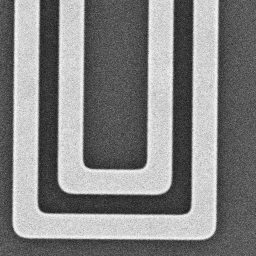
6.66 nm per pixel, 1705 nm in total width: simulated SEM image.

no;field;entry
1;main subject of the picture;groups of lines, slits or small figures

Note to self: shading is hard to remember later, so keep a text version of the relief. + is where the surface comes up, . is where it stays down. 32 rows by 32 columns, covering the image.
..+++...++.........+++..+++.....
..+++...++.........+++..+++.....
..+++..+++.........+++..+++.....
..+++..+++.........+++..+++.....
..+++..+++.........+++..+++.....
..+++..+++.........+++..+++.....
..+++..+++.........+++..+++.....
..+++..+++.........+++..+++.....
..+++..+++.........+++..+++.....
..+++..+++.........+++..+++.....
..+++..+++.........+++..+++.....
..+++..+++.........+++..+++.....
..+++..+++.........+++..+++.....
..+++..+++.........+++..+++.....
..+++..+++.........+++..+++.....
..+++..+++.........+++..+++.....
..+++..+++.........++...+++.....
..+++..+++.........++...+++.....
..+++..+++.........++...+++.....
..+++..+++.........++...+++.....
..+++..+++........+++...+++.....
..+++..++++++++++++++...+++.....
..+++..++++++++++++++...+++.....
..+++...+++++++++++++...+++.....
..+++...................+++.....
..+++...................+++.....
..+++...................+++.....
..+++++++++++++++++++++++++.....
..+++++++++++++++++++++++++.....
...+++++++++++++++++++++++......
................................
................................